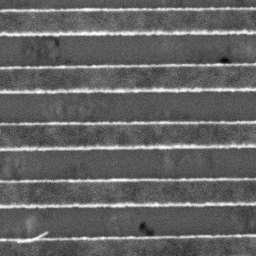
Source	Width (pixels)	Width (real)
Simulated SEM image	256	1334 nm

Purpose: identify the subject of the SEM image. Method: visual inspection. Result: lines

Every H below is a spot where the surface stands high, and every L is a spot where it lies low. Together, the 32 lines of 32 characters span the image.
LLLLLLLLLLLLLLLLLLLLLLLLLLLLLLLL
HHHHHHHHHHHHHHHHHHHHHHHHHHHHHHHH
HHHHHHHHHHHHHHHHHHHHHHHHHHHHHHHH
HHHHHHHHHHHHHHHHHHHHHHHHHHHHHHHH
LLLLLLLLLLLLLLLLLLLLLLLLLLLLLLLL
LLLLLLLLLLLLLLLLLLLLLLLLLLLLLLLL
LLLLLLLLLLLLLLLLLLLLLLLLLLLLLLLL
LLLLLLLLLLLLLLLLLLLLLLLLLLLLLLLL
HHHHHHHHHHHHHHHHHHHHHHHHHHHHHHHH
HHHHHHHHHHHHHHHHHHHHHHHHHHHHHHHH
HHHHHHHHHHHHHHHHHHHHHHHHHHHHHHHH
HHLLHLLLLLLLLLLLLLLLLLLLLLLLLLLL
LLLLLLLLLLLLLLLLLLLLLLLLLLLLLLLL
LLLLLLLLLLLLLLLLLLLLLLLLLLLLLLLL
LLLLLLLLLLLLLLLLLLLLLLLLLLLLLLLL
HLHHHHHHHHHHHHHHHHHHHHHHHHHHHHHH
HHHHHHHHHHHHHHHHHHHHHHHHHHHHHHHH
HHHHHHHHHHHHHHHHHHHHHHHHHHHHHHHH
HHHHHHHHHHHHHHHHHLLLLLLLLLLLLLLL
LLLLLLLLLLLLLLLLLLLLLLLLLLLLLLLL
LLLLLLLLLLLLLLLLLLLLLLLLLLLLLLLL
LLLLLLLLLLLLLLLLLLLLLLLLLLLLLLLL
LLLLLLLLLLLLLLLLLLLLHLHHHHHHHHHH
HHHHHHHHHHHHHHHHHHHHHHHHHHHHHHHH
HHHHHHHHHHHHHHHHHHHHHHHHHHHHHHHH
HHHHHHHHHHHHHHHHHHHHHHHHHHHHHHHH
LLLLLLLLLLLLLLLLLLLLLLLLLLLLLLLL
LLLLLLLLLLLLLLLLLLLLLLLLLLLLLLLL
LLLLLLLLLLLLLLLLLLLLLLLLLLLLLLLL
LLLLLLLLLLLLLLLLLLLLLLLLLLLHHHHH
HHHHHHHHHHHHHHHHHHHHHHHHHHHHHHHH
HHHHHHHHHHHHHHHHHHHHHHHHHHHHHHHH